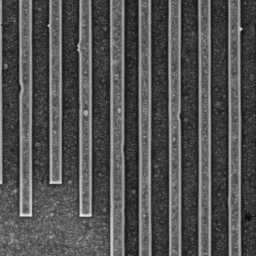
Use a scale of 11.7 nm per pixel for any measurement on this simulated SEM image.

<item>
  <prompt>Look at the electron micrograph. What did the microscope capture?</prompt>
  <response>parallel lines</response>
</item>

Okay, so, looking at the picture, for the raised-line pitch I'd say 348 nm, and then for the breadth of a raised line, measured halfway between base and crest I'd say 129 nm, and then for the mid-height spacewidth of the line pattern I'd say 18.9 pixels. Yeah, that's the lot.